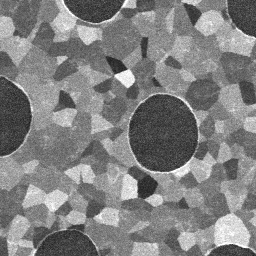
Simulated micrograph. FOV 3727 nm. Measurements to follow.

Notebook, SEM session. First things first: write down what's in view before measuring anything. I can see holes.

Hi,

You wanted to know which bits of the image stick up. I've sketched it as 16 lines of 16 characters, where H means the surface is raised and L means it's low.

HHHHLLLLHHHHHHLL
HHHHHHHHHHHHHHHL
HHHHHHHHHHHHHHHH
HHHHHHHHHHHHHHHH
HHHHHHHHHHHHHHHH
LHHHHHHHHHHHHHHH
LLHHHHHHHLLLHHHH
LLHHHHHHLLLLHHHH
LLHHHHHHLLLLHHHH
LHHHHHHHLLLLHHHH
HHHHHHHHHLLHHHHH
HHHHHHHHHHHHHHHH
HHHHHHHHHHHHHHHH
HHHHHHHHHHHHHHHH
HHHHLHHHHHHHHHHH
HHLLLLHHHHHHHLLH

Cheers